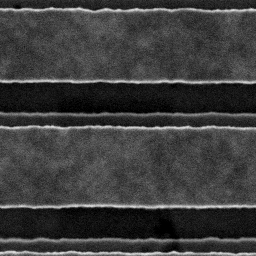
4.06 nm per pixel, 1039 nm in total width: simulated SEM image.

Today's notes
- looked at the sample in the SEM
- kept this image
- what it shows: lines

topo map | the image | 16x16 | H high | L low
HHHHHHHHHHHHHHHH
HHHHHHHHHHHHHHHH
HHHHHHHHHHHHHHHH
HHHHHHHHHHHHHHHH
HHHHHHHHHHHHHHHH
LLLLLLLLLLLLLLLL
LLLLLLLLLLLLLLLL
HHHHHHHHHHHHHHHH
HHHHHHHHHHHHHHHH
HHHHHHHHHHHHHHHH
HHHHHHHHHHHHHHHH
HHHHHHHHHHHHHHHH
HHHHHHHHHHHHHHHH
LLLLLLLLLLLLLLLL
LLLLLLLLLLLLLLLL
HHHHHHHHHHHHHHHH